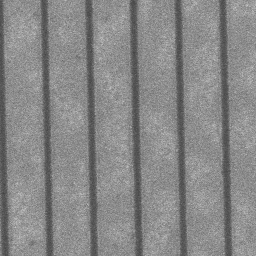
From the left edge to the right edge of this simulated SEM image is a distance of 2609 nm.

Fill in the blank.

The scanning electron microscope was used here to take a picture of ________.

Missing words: parallel lines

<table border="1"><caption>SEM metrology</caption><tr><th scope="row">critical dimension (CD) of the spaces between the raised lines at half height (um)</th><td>0.356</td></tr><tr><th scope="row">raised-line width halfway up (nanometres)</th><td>99.3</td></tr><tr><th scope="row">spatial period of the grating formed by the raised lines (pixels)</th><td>44.4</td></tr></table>